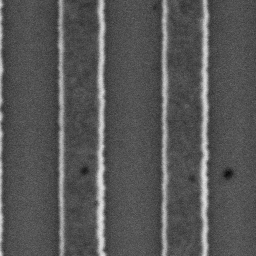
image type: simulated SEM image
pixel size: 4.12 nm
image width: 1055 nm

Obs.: lines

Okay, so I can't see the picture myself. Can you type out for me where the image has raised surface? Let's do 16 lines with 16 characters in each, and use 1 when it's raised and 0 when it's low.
0000110000111000
0000110000111000
0000110000111000
0000110000111000
0000110000111000
0000110000111000
0000110000111000
0000110000111000
0000110000111000
0000110000111000
0000110000111000
0000110000111000
0000110000111000
0000110000111000
0000110000111000
0000110000111000